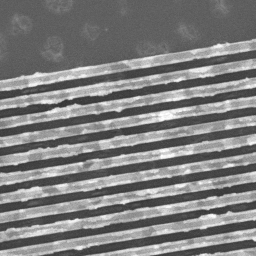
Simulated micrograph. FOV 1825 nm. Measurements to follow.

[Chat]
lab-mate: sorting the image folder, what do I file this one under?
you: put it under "parallel lines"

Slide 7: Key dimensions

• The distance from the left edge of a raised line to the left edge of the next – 133 nm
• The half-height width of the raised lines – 67.7 nm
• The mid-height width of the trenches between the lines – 64.2 nm